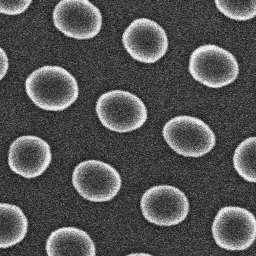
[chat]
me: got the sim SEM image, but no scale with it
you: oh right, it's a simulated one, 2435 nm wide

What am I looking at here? a regular array of raised bodies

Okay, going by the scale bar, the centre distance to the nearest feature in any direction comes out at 689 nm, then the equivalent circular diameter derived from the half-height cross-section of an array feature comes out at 414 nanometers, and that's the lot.